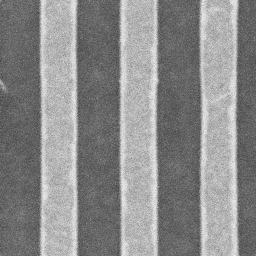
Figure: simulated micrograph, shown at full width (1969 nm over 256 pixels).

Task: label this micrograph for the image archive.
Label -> one or a few lines or trenches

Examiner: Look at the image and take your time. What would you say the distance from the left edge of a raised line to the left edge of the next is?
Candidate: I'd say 615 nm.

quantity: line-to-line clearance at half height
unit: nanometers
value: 362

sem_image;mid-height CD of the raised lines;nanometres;253